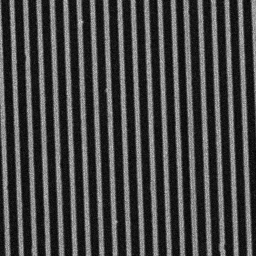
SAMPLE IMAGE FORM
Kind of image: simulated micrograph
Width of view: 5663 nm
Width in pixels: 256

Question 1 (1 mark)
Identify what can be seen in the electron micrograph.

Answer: parallel lines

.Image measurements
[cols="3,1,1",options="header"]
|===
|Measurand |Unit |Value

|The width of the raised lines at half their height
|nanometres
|105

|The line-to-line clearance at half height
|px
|8.62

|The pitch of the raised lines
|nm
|297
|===